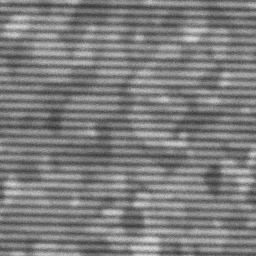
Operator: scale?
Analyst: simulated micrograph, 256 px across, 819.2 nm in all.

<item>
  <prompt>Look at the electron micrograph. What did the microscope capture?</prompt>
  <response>parallel lines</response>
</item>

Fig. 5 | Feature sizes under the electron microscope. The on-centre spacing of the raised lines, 28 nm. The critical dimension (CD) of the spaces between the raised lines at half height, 12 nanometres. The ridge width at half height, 15.2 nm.